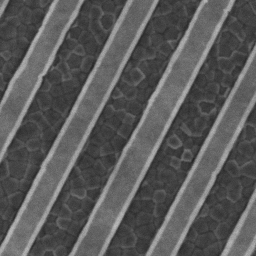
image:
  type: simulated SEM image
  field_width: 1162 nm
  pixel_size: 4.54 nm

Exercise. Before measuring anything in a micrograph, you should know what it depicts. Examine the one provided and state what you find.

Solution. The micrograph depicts one or a few lines or trenches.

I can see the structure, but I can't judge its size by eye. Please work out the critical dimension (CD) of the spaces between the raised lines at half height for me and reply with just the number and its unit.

193 nm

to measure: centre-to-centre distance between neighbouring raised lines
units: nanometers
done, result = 302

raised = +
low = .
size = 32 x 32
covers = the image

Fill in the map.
+......+++......+++......++++...
......++++.....++++......+++....
......+++......+++......++++....
.....+++......++++......+++.....
.....+++......+++......++++.....
....+++......++++......+++......
....+++......+++......++++......
...+++......++++......+++......+
...+++......+++......++++......+
..+++......++++......+++......++
.++++......+++......++++......++
.+++......++++.....++++......+++
++++......+++......++++......+++
+++......++++.....++++......+++.
+++......+++......++++......+++.
++......++++......+++......+++..
++......+++......++++.....++++..
+......++++.....++++......+++...
+......+++......++++.....++++...
......+++......++++......+++....
......+++......++++.....++++....
.....+++......++++......+++.....
.....+++......++++.....++++.....
....+++......++++......+++......
....+++......+++......++++......
...+++......++++......+++......+
...+++......+++......++++......+
..+++......++++......+++......++
..+++......+++......+++.......++
.+++......++++......+++......+++
.+++......+++......+++.......+++
+++......++++......+++......+++.